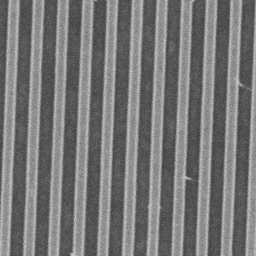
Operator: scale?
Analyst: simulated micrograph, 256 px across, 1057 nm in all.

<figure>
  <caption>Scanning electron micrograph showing parallel lines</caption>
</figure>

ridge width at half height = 0.0392 microns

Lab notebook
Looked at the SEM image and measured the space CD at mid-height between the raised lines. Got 62.9 nm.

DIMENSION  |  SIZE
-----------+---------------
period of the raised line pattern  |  102 nm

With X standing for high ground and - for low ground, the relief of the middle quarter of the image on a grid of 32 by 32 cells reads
----XX-----XX----XX----XX----XX-
----XX----XXX----XX----XX----XX-
----XX----XXX----XX----XX----XX-
----XX----XXX----XX----XX----XX-
----XX----XXX----XX----XX----XX-
----XX----XX-----XX----XX----XX-
----XX----XX----XXX----XX----XX-
----XX----XX----XXX----XX----XX-
----XX----XX----XXX---XXX----XX-
----XX----XX----XXX---XXX----XX-
----XX----XX----XX----XXX----XX-
----XX----XX----XX----XXX----XX-
----XX----XX----XX----XXX----XX-
----XX----XX----XX----XXX---XXX-
----XX----XX----XX----XXX---XXX-
----XX----XX----XX----XX----XXX-
---XXX----XX----XX----XX----XXX-
---XXX----XX----XX----XX----XXX-
---XXX----XX----XX----XX----XXX-
---XXX----XX----XX----XX----XXX-
----XX----XX----XX----XX----XX--
---XXX---XXX----XX----XX----XX--
---XXX----XX----XX----XX----XX--
---XXX----XX----XX----XX----XX--
---XXX----XX----XX----XX----XX--
---XXX----XX----XX----XX----XX--
---XX-----XX----XX----XX----XX--
---XX----XXX----XX----XX----XX--
---XX----XXX----XX----XX----XXX-
---XX----XXX----XX----XX----XX--
---XX----XXX----XX----XX----XX--
---XX----XX-----XX----XX----XX--